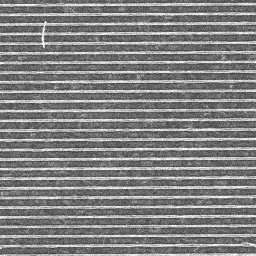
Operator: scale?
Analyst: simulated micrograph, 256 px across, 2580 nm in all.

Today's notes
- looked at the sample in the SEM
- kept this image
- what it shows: parallel lines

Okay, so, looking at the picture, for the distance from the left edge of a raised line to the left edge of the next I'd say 0.0971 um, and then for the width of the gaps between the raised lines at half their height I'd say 78.1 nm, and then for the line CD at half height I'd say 17.6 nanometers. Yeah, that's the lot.